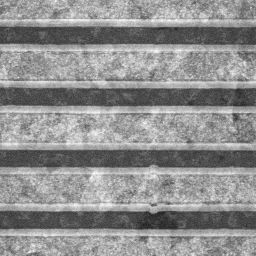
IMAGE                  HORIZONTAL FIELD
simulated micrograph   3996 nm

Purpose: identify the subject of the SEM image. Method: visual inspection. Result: parallel lines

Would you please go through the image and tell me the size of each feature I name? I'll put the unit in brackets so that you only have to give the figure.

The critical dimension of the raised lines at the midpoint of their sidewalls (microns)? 0.572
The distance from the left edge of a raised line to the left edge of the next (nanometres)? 960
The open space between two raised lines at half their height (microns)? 0.394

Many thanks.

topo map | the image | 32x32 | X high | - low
XXXXXXXXXXXXXXXXXXXXXXXXXXXXXXXX
XXXXXXXXXXXXXXXXXXXXXXXXXXXXXXXX
XXXXXXXXXXXXXXXXXXXXXXXXXXXXXXXX
--------------------------------
--------------------------------
--------------------------------
XXXXXXXXXXXXXXXXXXXXXXXXXXXXXXXX
XXXXXXXXXXXXXXXXXXXXXXXXXXXXXXXX
XXXXXXXXXXXXXXXXXXXXXXXXXXXXXXXX
XXXXXXXXXXXXXXXXXXXXXXXXXXXXXXXX
XXXXXXX--XXXXXXXXXXXXXXXXXXXXXXX
--------------------------------
--------------------------------
--------------------------------
XXXXXXXXXXXXXXXXXXXXXXXXXXXXXXXX
XXXXXXXXXXXXXXXXXXXXXXXXXXXXXXXX
XXXXXXXXXXXXXXXXXXXXXXXXXXXXXXXX
XXXXXXXXXXXXXXXXXXXXXXXXXXXXXXXX
--------------------------------
--------------------------------
--------------------------------
XXXXXXXXXXXXXXXXXXXXXX------XX--
XXXXXXXXXXXXXXXXXXXXXXXXXXXXXXXX
XXXXXXXXXXXXXXXXXXXXXXXXXXXXXXXX
XXXXXXXXXXXXXXXXXXXXXXXXXXXXXXXX
XXXXXXXXXXXXXXXXXXXXXXXXXXXXXXXX
--------------------------------
--------------------------------
--------------------------------
XXXXXXXXXXXXXXXXXXXXXXXXXXXXXXXX
XXXXXXXXXXXXXXXXXXXXXXXXXXXXXXXX
XXXXXXXXXXXXXXXXXXXXXXXXXXXXXXXX